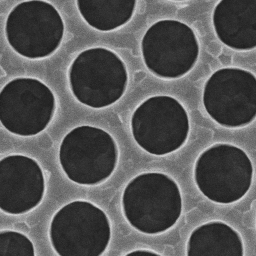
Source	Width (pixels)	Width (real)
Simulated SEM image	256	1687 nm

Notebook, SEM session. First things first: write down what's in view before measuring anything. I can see holes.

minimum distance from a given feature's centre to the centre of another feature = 0.51 micrometres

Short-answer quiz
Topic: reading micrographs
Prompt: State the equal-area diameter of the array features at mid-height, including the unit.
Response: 386 nanometres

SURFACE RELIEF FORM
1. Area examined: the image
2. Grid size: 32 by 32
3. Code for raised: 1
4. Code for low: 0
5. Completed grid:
11000011110000000111111111100000
10000001110000000111111111100000
10000000111000001111101111100000
10000000111100111110000011100000
10000000111111111100000011100000
10000001111111111100000001110000
11000001110000111100000001111111
11111111100000011100000001111111
11111111100000001100000011111111
11111111100000001111000111000000
10000111100000001111111111000000
00000011100000001111111110000000
00000001110000011100001110000000
00000001111111111000000111000000
00000001111111111000000111000000
00000011111111110000000011100001
10000111100001111000000011111111
11111111000000111000000111111111
11111111000000011100001111000011
11011110000000011111111110000001
00000111000000111111111100000001
00000111000000111111111100000000
00000111100001110000001100000001
00000011111111110000001110000001
00000111111111100000000111000011
00000111100111100000000111111111
10011110000001110000000111111111
11111110000001110000001111111111
11111100000000111000011110000111
00011100000000111111111100000011
00001100000001111111111000000011
00001110000001111001111000000011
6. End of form